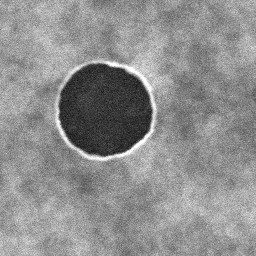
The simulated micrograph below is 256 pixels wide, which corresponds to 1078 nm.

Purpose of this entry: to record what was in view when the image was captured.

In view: holes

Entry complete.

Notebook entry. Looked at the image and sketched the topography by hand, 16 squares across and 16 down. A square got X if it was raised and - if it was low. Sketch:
XXXXXXXXXXXXXXXX
XXXXXXXXXXXXXXXX
XXXXXXXXXXXXXXXX
XXXXXXXXXXXXXXXX
XXXXX---XXXXXXXX
XXXX-----XXXXXXX
XXXX-----XXXXXXX
XXXX-----XXXXXXX
XXXX-----XXXXXXX
XXXXX---XXXXXXXX
XXXXXXXXXXXXXXXX
XXXXXXXXXXXXXXXX
XXXXXXXXXXXXXXXX
XXXXXXXXXXXXXXXX
XXXXXXXXXXXXXXXX
XXXXXXXXXXXXXXXX